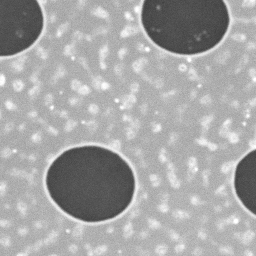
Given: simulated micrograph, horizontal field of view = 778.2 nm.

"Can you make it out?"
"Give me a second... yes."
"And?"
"holes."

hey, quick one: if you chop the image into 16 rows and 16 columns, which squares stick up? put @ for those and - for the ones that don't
---@@@@@@-----@@
---@@@@@@-----@@
--@@@@@@@-----@@
-@@@@@@@@@@@@@@@
@@@@@@@@@@@@@@@@
@@@@@@@@@@@@@@@@
@@@@@@@@@@@@@@@@
@@@@@@@@@@@@@@@@
@@@@@@@@@@@@@@@@
@@@@---@@@@@@@@@
@@@-----@@@@@@@-
@@@-----@@@@@@@-
@@@-----@@@@@@@-
@@@@---@@@@@@@@@
@@@@@@@@@@@@@@@@
@@@@@@@@@@@@@@@@